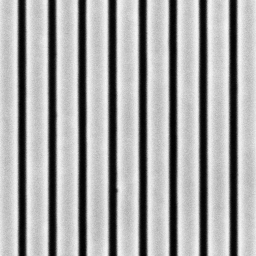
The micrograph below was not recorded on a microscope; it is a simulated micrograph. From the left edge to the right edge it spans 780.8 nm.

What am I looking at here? parallel lines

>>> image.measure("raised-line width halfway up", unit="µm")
0.0676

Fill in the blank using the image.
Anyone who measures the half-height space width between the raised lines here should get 25.2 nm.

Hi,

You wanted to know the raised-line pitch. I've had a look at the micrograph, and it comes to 92.2 nm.